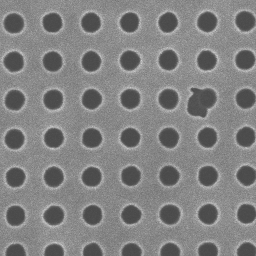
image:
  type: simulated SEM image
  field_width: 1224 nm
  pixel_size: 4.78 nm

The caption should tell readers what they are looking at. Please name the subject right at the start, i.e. a regular array of holes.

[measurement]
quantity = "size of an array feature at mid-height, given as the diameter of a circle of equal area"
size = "89.7 nanometres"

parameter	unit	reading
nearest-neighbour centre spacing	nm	182